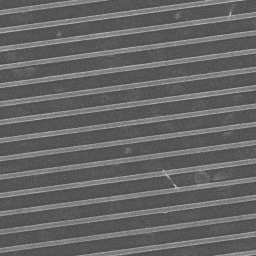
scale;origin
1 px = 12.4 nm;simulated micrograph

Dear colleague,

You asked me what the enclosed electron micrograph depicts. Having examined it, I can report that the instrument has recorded parallel lines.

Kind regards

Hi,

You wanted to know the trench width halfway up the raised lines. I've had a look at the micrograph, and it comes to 0.164 microns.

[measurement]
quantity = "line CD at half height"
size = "58.3 nm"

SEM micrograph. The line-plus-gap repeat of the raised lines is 224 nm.